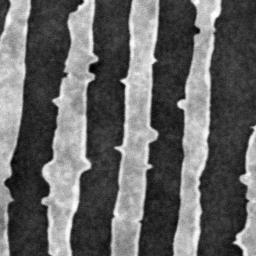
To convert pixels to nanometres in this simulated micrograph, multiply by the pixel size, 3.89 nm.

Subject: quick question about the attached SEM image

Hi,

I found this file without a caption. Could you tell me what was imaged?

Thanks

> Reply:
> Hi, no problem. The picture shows one or a few lines or trenches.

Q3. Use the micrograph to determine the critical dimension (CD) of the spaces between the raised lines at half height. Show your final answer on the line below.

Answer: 158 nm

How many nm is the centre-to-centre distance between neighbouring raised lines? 243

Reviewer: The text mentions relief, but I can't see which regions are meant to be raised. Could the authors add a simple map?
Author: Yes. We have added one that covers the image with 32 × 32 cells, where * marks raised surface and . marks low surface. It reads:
.***.......*.....***....***.....
.***.....***....****.....**.....
.**......***....****....***.....
.**......**.....****.....**.....
***......**......**.....***.....
***......**......**.....**......
***......**......**.....**......
***.....****....***.....**......
***.....***.....***.....**......
***.....****....***.....**......
***.....***.....***....***......
***.....***.....***....***......
***....****.....***....***......
***....****.....***....***......
***....****.....***....***......
**.....****.....***....***......
**.....****.....***....***......
**.....***......***....***.....*
**.....***.....***.....***.....*
*......***.....***.....***.....*
*.....*****....***.....**......*
*....*****.....***.....**......*
*.....****.....***.....**.....**
*.....****.....***.....**......*
*.....****.....***.....**......*
*.....***......***.....**......*
*.....***.....****....***......*
*.....***.....***.....***......*
*.....***.....***.....***......*
*.....**......***.....***.....**
*.....***.....***.....**......**
*.....***.....***.....**.......*